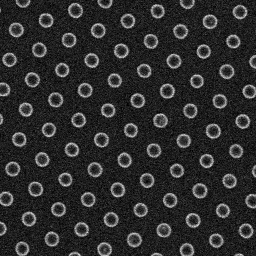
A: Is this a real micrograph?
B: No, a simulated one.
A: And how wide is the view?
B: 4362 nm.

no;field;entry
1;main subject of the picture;a regular array of raised bodies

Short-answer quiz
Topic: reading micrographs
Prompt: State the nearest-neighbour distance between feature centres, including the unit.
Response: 517 nanometres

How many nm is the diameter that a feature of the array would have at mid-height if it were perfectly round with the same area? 231